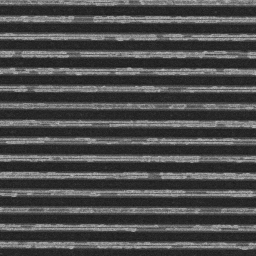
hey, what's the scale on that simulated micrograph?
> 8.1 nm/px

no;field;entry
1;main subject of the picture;parallel lines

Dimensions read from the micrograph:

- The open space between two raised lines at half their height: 93.2 nm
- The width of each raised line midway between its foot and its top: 49.6 nanometers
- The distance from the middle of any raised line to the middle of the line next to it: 141 nm